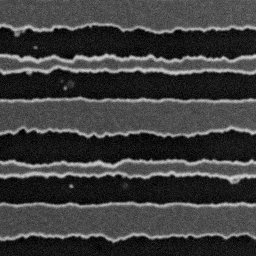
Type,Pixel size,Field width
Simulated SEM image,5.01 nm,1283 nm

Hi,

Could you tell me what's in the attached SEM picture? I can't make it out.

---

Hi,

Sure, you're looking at lines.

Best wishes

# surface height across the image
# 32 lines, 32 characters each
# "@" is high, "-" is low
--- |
@@@@@@@@@@@@@@@@@@@@@@@@@@@@@@@@
@@@@@@@@@@@@@@@@@@@@@@@@@@@@@@@@
@@@@@@@@@@@@@@@@@@@@@@@@@@@@@@@@
-@@@@@@@@@-----@@@@@@@@@@@@@@@@@
--------------------------------
--------------------------------
--------------------------------
@@@@@@@@@@@@@@@@@@@@@-@@@@@@@@@@
@@@@@@@@@@@@@@@@@@@@@@@@@@@@@@@@
--------------------------------
--------------------------------
--------------------------------
@@@@@@@@@@@@@@@@@@@@@@@-@@----@@
@@@@@@@@@@@@@@@@@@@@@@@@@@@@@@@@
@@@@@@@@@@@@@@@@@@@@@@@@@@@@@@@@
@@@@@@@@@@@@@@@@@@@@@@@@@@@@@@@@
@@---@---@@@@@@@@@@@@@@@@@@@---@
--------------------------------
--------------------------------
--------------------------------
@@@---@@@@@@@--@@@@@@@@@@@@@@@@@
@@@@@@@@@@@@@@@@@@@@@@@@@@@@@@@@
--------------------------------
--------------------------------
--------------------------------
@---@@--@----@@@@-@--@@@----@@@-
@@@@@@@@@@@@@@@@@@@@@@@@@@@@@@@@
@@@@@@@@@@@@@@@@@@@@@@@@@@@@@@@@
@@@@@@@@@@@@@@@@@@@@@@@@@@@@@@@@
@@@@-@@@@-@@@@@@@-@@@@@@@---@--@
--------------------------------
--------------------------------